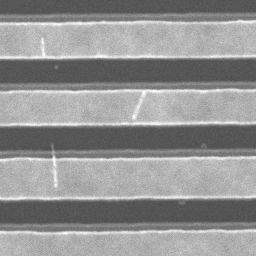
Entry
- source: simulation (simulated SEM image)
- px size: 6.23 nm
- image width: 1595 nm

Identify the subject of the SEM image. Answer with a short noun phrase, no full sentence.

lines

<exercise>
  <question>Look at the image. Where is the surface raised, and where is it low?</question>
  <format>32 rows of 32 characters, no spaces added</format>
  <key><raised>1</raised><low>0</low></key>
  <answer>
00000000000000000000000000000000
00000000000000000000000000000000
00000000000000000000000000000000
11111111111111111111111111111111
11111111111111111111111111111111
11111111111111111111111111111111
11111111111111111111111111111111
00000000000000000000000000000000
00000000000000000000000000000000
00000000000000000000000000000000
00000000000000000000000000000000
11111111111111111111111111111111
11111111111111111111111111111111
11111111111111111111111111111111
11111111111111111111111111111111
11111111111111111111111111111111
00000000000000000000000000000000
00000000000000000000000000000000
00000000000000000000000000000000
00000000000000000000000000000000
11111111111111111111111111111111
11111111111111111111111111111111
11111111111111111111111111111111
11111111111111111111111111111111
11111111111111111111111111111111
00000000000000000000000000000000
00000000000000000000000000000000
00000000000000000000000000000000
00000000000000000000000000000000
11111111111111111111111111111111
11111111111111111111111111111111
11111111111111111111111111111111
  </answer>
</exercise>